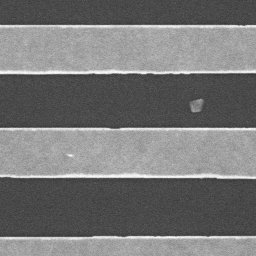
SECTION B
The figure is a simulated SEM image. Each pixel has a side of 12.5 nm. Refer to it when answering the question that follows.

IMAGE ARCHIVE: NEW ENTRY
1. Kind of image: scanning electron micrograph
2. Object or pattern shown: lines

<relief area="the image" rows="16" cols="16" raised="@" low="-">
----------------
----------------
@@@@@@@@@@@@@@@@
@@@@@@@@@@@@@@@@
@@@@@@@@@@@@@@--
----------------
----------------
----------------
@@@@@@@@@@@@@@@@
@@@@@@@@@@@@@@@@
@@@@@@@@@@@@@@@@
----------------
----------------
----------------
----------------
@@@@@@@@@@@@@@@@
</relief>